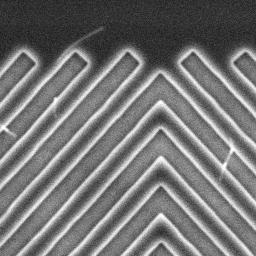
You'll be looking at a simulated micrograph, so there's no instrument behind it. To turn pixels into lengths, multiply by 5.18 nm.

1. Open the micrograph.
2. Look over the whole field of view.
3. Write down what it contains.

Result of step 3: groups of lines, slits or small figures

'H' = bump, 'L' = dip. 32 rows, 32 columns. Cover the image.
HHHHHHHHHHHHHHHHHHHHHHHHHHHHHHHH
HHHHHHHHHHHHHHHHHHHHHHHHHHHHHHHH
HHHHHHHHHHHHHHHHHHHHHHHHHHHHHHHH
HHHHHHHHHHHHHHHHHHHHHHHHHHHHHHHH
HHHHHHHHHHHHHHHHHHHHHHHHHHHHHHHH
HHHHHHHHHHHHHHHHHHHHHHHHHHHHHHHH
HHHHHHHHHHHHHHHHHHHHHHHHHHHHHHHH
HHLLHHHHLLLHHHHLLHHHHHHLLHHHHLLL
HLLLHHHLLLLHHHLLLHHHHHHLLLHHHHLL
LLLHHHLLLLHHHLLLHHHHLHHHLLLHHHLL
LLHHHLLLLHHHLLLHHHHLLLHHHLLLHHHL
LHHHHLLLHHHLLLHHHHLLLLLHHHLLLHHH
HHHHLLLHHHLLLLHHHLLLLLLLHHHLLLHH
HHHLLLHHHLLLLHHHLLLHHLLLHHHLLLLH
HHLLLHHHLLLLHHHLLLHHHHLLLHHHLLLL
HLLLHHHLLLLHHHLLLHHHHHHLLLHHHLLL
LLLLHHHLLLHHHLLLHHHHLHHHLLLHHHLL
LLLHHHLLLHHHLLLHHHHLLLHHHLLLHHHL
LLHHHLLLHHHLLLHHHHLLLLHHHHLLLHHH
LHHHLLLHHHLLLLHHHLLLLLLLHHHLLLHH
HHHLLLHHHLLLLHHHLLLHHLLLHHHHLLLH
HHLLLHHHHLLLHHHLLLHHHHLLLHHHHLLL
HLLLHHHHLLLHHHLLLHHHHHHLLLHHHLLL
LLLHHHHLLLHHHLLLHHHHLHHHLLLHHHLL
LLHHHHLLLHHHLLLLHHHLLHHHHLLLHHHL
LLHHHLLLHHHLLLLHHHLLLLHHHHLLLHHH
LHHHLLLHHHHLLLHHHLLLLLLHHHHLLLHH
HHHLLLHHHLLLLHHHLLLHHLLLHHHHLLLH
HHLLLLHHHLLLHHHLLLHHHHLLLHHHLLLL
HLLLLHHHLLLHHHLLLHHHHHHLLLHHHLLL
LLLLHHHLLLHHHLLLLHHHHHHHLLLHHHLL
LLLHHHLLLHHHLLLLHHHLLHHHHLLLHHHL